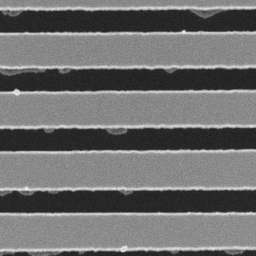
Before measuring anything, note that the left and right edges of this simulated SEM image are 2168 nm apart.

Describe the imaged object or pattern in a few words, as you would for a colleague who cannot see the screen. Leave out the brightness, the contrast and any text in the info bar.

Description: lines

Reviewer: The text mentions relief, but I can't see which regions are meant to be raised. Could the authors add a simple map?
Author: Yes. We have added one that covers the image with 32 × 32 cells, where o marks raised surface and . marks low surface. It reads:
oooooooooooooooooooooooooooooooo
................................
................................
................................
oooooooooooooooooooooooooooooooo
oooooooooooooooooooooooooooooooo
oooooooooooooooooooooooooooooooo
oooooooooooooooooooooooooooooooo
oooooooo.ooo.oooo.ooooo.ooo.o.o.
................................
................................
oooooooooooooooooooooooooooooooo
oooooooooooooooooooooooooooooooo
oooooooooooooooooooooooooooooooo
oooooooooooooooooooooooooooooooo
oooooooooooooooooooooooooooooooo
................................
................................
................................
oooooooooooooooooooooooooooooooo
oooooooooooooooooooooooooooooooo
oooooooooooooooooooooooooooooooo
oooooooooooooooooooooooooooooooo
oooooooooooooooooooooooooooooooo
................................
................................
................................
oooooooooooooooooooooooooooooooo
oooooooooooooooooooooooooooooooo
oooooooooooooooooooooooooooooooo
oooooooooooooooooooooooooooooooo
................................